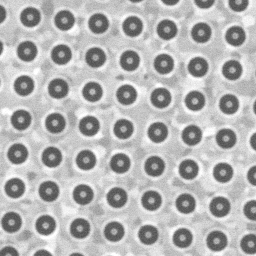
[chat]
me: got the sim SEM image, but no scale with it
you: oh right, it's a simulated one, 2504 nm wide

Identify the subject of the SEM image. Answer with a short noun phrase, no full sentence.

an array of small figures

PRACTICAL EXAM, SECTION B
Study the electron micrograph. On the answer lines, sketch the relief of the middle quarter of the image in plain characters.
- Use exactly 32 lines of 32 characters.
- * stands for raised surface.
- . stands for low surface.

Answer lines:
******....****.....***......***.
**************....****......***.
***********************....****.
********************************
.****....***********************
.***......****....**************
..**......***.....****....******
.***......***..*...**......***..
*****.....***......**...*..***..
******...****.....***......***..
***************..*****.....***..
************************.******.
********************************
****.....*****..****************
.***.....***.....*****...*******
.**...*..***......***.....****..
***......***..*...**......***...
****.....***......***..*..***...
******.******....****.....***...
**********************...*****..
******************************..
****...*************************
***.....****....****************
***.....***......***.....*****..
***..*..***...*..***.....****...
***.....***......***..*...**....
****...*****....****......**...*
*************..*****.....***....
**********************..*****...
********************************
***....*****..******************
**......***.....****...*********